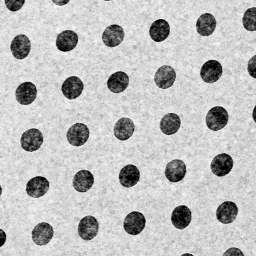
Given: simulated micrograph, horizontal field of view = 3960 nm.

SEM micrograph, a regular array of holes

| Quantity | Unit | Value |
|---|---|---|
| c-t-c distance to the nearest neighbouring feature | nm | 718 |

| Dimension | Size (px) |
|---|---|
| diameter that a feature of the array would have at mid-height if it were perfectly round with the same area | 23.2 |